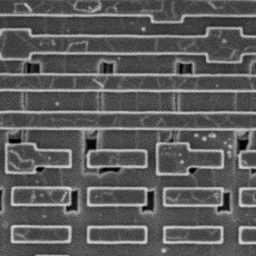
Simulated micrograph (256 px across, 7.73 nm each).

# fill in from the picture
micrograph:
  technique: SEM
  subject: wiring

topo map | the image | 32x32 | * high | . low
********************************
********************************
...................****.........
................................
*******..**..............******.
********************************
********************************
..........................****..
................................
********************************
********************************
................................
................................
................................
********************************
********************************
................................
................................
.****...............****........
.********..*******..********..**
.********..*******..********..**
.***................***.........
................................
................................
..*******..*******...*******..**
..******...*******...******...**
................................
................................
..******...*******...*******..*.
..*******..*******...*******..**
................................
................................